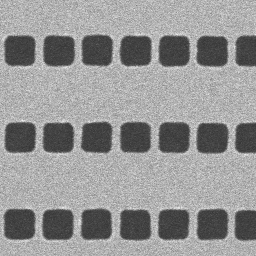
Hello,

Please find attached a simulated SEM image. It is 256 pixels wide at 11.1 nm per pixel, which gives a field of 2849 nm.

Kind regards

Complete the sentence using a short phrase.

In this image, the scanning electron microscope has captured a regular array of holes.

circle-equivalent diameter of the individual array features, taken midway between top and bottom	34.3	px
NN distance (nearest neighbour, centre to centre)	38.3	px